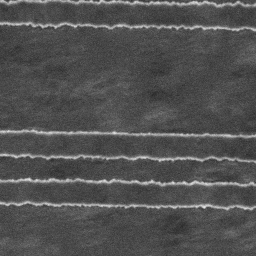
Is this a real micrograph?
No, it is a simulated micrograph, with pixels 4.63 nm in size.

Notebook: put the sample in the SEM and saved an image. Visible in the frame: lines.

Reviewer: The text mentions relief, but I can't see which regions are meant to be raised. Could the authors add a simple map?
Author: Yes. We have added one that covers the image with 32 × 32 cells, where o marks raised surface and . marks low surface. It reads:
ooooooooooooooooooooooooooo.oo..
oooooooooooooooooooooooooooooooo
oooooooooooooooooooooooooooooooo
.......................o.ooooooo
................................
................................
................................
................................
................................
................................
................................
................................
................................
................................
................................
................................
ooooo...........................
oooooooooooooooooooooooooooooooo
oooooooooooooooooooooooooooooooo
.ooooooooooooooooooooooooooooooo
................................
................................
ooooooooooo...o.................
oooooooooooooooooooooooooooooooo
oooooooooooooooooooooooooooooooo
ooo.oooooooooooooooooooooooooooo
................................
................................
................................
................................
................................
................................